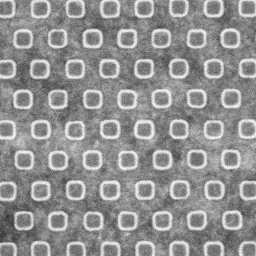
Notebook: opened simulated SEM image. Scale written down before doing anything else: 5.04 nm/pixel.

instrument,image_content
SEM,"a regular array of raised bodies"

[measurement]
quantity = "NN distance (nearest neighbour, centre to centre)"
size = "172 nm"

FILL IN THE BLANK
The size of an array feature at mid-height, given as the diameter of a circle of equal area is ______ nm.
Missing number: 95.1